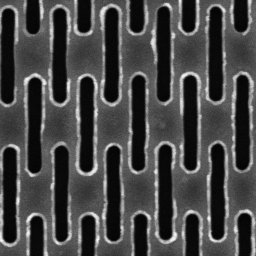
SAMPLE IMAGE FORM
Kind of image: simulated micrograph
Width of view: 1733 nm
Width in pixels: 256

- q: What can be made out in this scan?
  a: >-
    a regular array of holes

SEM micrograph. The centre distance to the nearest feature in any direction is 0.352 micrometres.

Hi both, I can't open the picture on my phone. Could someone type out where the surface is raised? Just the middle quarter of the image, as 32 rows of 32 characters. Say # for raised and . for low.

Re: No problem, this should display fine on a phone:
.#########....#########....#####
.#########....#########....#####
.#########....#########....#####
.####..###....###...###....###..
.###....##....###...###....###..
.###....##....###...###....###..
.###....##....###...###....###..
.###....##....###...###....###..
####....##....###....##...####..
####....###..####....#########..
####....#########....#########..
####...##########...##########..
####...##########...##########..
####...##########...##########..
####...##########...##########..
####...##########...##########..
####...##########...##########..
####...##########...##########..
####...##########...##########..
####...##########...##########..
####...#####.####...####..####..
.###...####...###...####...###..
.###...####...###...####...###..
.###....###...###...####...###..
.###....###...###...####...###..
.###...####...###...####...###..
.###...####...####.#####...####.
.##########...##########...#####
.#########....##########...#####
.#########....#########....#####
.#########....#########....#####
.#########....#########....#####